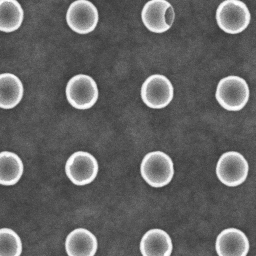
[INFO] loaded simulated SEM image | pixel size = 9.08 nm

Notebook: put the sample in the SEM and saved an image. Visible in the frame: raised bodies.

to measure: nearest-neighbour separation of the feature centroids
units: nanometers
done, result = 684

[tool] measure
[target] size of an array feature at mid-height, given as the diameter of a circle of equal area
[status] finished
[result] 287 nm